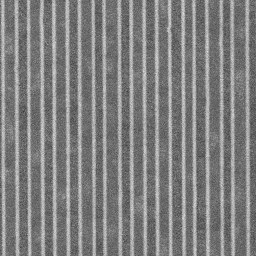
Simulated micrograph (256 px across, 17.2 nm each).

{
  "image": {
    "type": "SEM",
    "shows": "parallel lines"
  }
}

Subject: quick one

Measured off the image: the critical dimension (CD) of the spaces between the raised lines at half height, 200 nanometres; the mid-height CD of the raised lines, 14.4 pixels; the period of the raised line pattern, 441 nanometers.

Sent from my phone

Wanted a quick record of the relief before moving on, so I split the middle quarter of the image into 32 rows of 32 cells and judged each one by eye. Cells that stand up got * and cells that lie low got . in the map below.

*...***...****...***...***....**
*...***...****...***...***....**
*...***...****...***...***....**
*...***...****...***...***....**
*...***...****...***...***....**
*...***...****...***...***....**
*...***...****...***...***....**
*...***...****...***...***....**
*...***...****...***...***....**
*...***...****...***...***....**
*...***...****...***...***....**
*...***...****...***...***....**
*...***...****...***...***....**
*...***...****...***...***....**
*...***...****...***...***....**
*...***...****...***...***....**
*...***...****...***...***....**
*...***...****...***...***....**
*...***...****...***...***....**
*...***...****...***...***....**
*...***...****...***...***....**
*...***...****...***...***....**
*...***...****...***...***....**
*...***...****...***...***....**
*...***...****...***...***....**
*...***...****...***...***....**
*...***...****...***...***....**
*...***...****...***...***....**
*...***...****...***...***....**
*...***...****...***...***....**
*...***...****...***...***....**
*...***...****...***...***....**